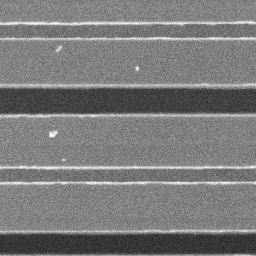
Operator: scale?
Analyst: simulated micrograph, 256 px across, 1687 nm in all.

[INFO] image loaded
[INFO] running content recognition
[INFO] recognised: lines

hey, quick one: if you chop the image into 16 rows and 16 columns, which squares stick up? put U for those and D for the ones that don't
UUUUUUUUUUUUUUUU
UUUUUUUUUUUUUUUU
UUUUUUUUUUUUUUUU
UUUUUUUUUUUUUUUU
UUUUUUUUUUUUUUUU
DDDDDDDDDDDDDDDD
DDDDDDDDDDDDDDDD
UUUUUUUUUUUUUUUU
UUUUUUUUUUUUUUUU
UUUUUUUUUUUUUUUU
UUUUUUUUUUUUUUUU
UUUUUUUUUUUUUUUU
UUUUUUUUUUUUUUUU
UUUUUUUUUUUUUUUU
DDDDDDDDDDDDDDDD
DDDDDDDDDDDDDDDD